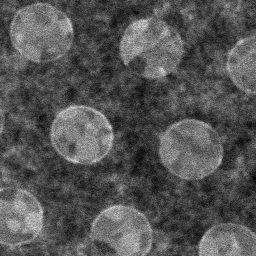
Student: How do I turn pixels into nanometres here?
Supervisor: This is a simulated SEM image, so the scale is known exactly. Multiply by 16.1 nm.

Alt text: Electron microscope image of raised bodies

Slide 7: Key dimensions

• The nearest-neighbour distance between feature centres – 1.77 micrometres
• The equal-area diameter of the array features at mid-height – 946 nm